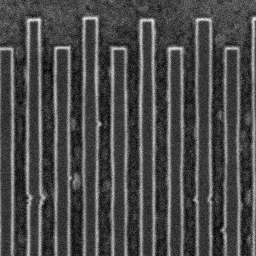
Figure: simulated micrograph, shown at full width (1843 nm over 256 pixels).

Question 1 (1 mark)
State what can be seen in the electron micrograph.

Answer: parallel lines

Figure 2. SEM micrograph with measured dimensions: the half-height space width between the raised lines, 0.108 micrometres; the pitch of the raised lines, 204 nanometers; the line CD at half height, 94.5 nanometres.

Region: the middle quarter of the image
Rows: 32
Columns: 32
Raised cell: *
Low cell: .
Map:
*....***....***....***....***...
*....***....***....***....***...
*....***....***....***....***...
*....***....***....***....***...
*....***....***....***....***...
*....***....***....***....***...
*....***....***....***....***...
*....***....***....***....***...
*....***....***....***....***...
*....***....***....***....***...
*....***....***....***....***...
*....***....***....***....****..
*....***....***....***....****..
*....***....***....***....***...
*....***....***....***....****..
*....****...***....****...****..
*....***....***....****...****..
*....***....***....****...****..
*....***....***....****...****..
*....***....***....****...****..
*....***....****...****...****..
*....***....****...****...****..
*....***....****...****...****..
*....***....****...***....****..
*....***....****...***.....***..
*....***....***....***.....**...
*....***....***....***.....**...
*....***....***....***.....**...
*....***....***.....**.....**...
*....***....***.....***....**...
*....***....***....****....**...
*....***....***....***.....**...